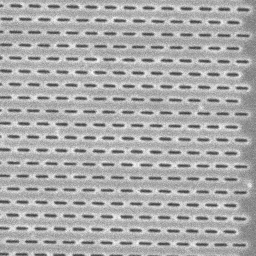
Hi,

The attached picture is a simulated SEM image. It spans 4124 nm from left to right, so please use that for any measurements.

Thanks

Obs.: a regular array of holes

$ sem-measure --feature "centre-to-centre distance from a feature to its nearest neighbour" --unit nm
255